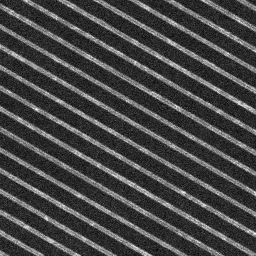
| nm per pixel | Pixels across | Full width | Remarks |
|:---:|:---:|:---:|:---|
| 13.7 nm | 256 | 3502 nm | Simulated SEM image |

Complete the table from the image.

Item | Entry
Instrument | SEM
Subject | parallel lines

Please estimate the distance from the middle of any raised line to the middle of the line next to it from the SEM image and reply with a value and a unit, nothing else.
17.8 px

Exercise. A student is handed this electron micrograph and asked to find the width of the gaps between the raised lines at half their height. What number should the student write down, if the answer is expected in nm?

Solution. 198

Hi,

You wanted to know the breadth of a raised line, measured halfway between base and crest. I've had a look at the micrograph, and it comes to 47.4 nanometers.